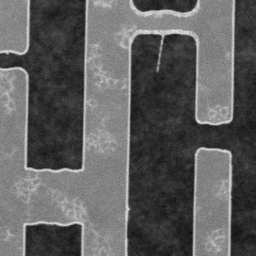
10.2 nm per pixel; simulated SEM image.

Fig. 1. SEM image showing one or a few lines or trenches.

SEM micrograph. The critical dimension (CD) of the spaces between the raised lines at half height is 0.667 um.